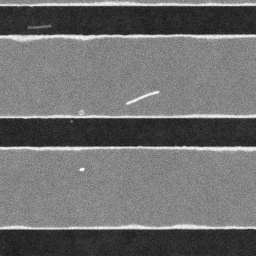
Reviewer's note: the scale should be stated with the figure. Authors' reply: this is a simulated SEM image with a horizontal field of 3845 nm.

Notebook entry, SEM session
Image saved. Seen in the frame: lines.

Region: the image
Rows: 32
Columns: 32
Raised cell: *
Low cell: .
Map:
********************************
................................
................................
................................
********************************
********************************
********************************
********************************
********************************
********************************
********************************
********************************
********************************
********************************
********************************
................................
................................
................................
********************************
********************************
********************************
********************************
********************************
********************************
********************************
********************************
********************************
********************************
********************************
................................
................................
................................